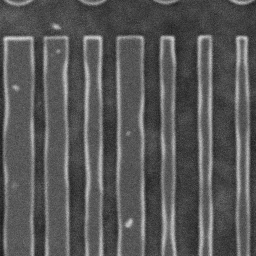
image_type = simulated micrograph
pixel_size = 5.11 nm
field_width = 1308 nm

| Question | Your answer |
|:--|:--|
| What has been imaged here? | groups of lines, slits or small figures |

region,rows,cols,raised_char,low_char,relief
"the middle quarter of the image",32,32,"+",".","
+....++++.....++++++....++++....
......+++.....++++++....++++....
......+++.....++++++....++++....
......+++.....++++++....++++....
......+++.....++++++....++++....
+.....+++.....++++++....++++....
+.....+++.....++++++.....+++....
+.....+++.....++++++.....+++....
+.....+++.....++++++....++++....
+.....+++.....++++++....++++....
+.....+++.....++++++....+++.....
+.....+++.....++++++....+++.....
+.....+++.....+++++.....+++.....
+.....+++.....+++++......++.....
+....++++.....+++++......++.....
+....++++.....+++++......++.....
+....++++.....++++++.....+++....
+....++++.....++++++.....+++....
+....++++.....++++++.....+++....
+....++++.....++++++.....+++....
+.....+++.....++++++.....+++....
+.....+++.....++++++.....+++....
+.....+++.....++++++.....+++....
+.....+++.....++++++.....+++....
+.....+++.....++++++.....+++....
+.....+++.....++++++.....+++....
+.....+++.....++++++.....+++....
+.....+++.....++++++....++++....
+.....+++.....++++++....++++....
+.....+++....+++++++....++++....
+.....+++....+++++++.....+++....
+.....+++....+++++++.....+++....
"